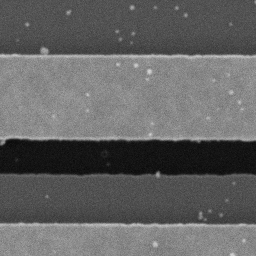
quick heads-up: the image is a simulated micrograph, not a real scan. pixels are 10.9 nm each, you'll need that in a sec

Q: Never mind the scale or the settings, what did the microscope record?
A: lines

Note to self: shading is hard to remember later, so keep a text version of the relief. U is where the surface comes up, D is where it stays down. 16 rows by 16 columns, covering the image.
UUUUUUUUUUUUUUUU
UUUUUUUUUUUUUUUU
UUUUUUUUUUUUUUUU
UUUUUUUUUUUUUUUU
UUUUUUUUUUUUUUUU
UUUUUUUUUUUUUUUU
UUUUUUUUUUUUUUUU
UUUUUUUUUUUUUUUU
UUUUUUUUUUUUUUUU
DDDDDDDDDDDDDDDD
DDDDDDDDDDDDDDDD
UUUUUUUUUUUUUUUU
UUUUUUUUUUUUUUUU
UUUUUUUUUUUUUUUU
UUUUUUUUUUUUUUUU
UUUUUUUUUUUUUUUU